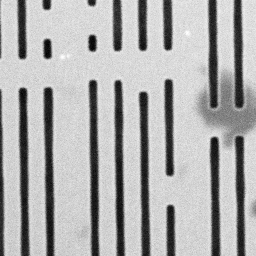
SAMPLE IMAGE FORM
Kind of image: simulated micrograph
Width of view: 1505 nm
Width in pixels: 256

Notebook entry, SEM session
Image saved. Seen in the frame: groups of lines, slits or small figures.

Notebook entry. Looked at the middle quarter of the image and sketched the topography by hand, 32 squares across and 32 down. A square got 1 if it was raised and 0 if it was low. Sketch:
11111111111111111111111111111111
11111111111111111111111111111111
11111111111111111111111111111111
11111111111111111111111111111111
11111100111110111111111110011111
11111100011100011111111110011111
11111100011100011111111110011111
11111100011100011110011110011111
11111100011100011110011110011111
11111100011100011110011110011111
11111100011100011110011110011111
11111100011100011110011110011111
11111100011100011110011110011111
11111100011100011110011110001111
11111100011100011110011110001111
11111100011100011110011110001111
11111100011110011110011110011111
11111100011110011110011110011111
11111100011110011110011110011111
11111100011110011110011110001111
11111100011110011110011110001111
11111100011110011110011110001111
11111100011110011110011110001111
11111100011110011110011110001111
11111100011110011110011110001111
11111100011110011110011110001111
11111100011110011110011110001111
11111100011110011110011111001111
11111100011110011110011111111111
11111100011110011110011111111111
11111100011110011110011111111111
11111100011110011110011111111111